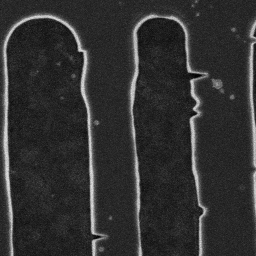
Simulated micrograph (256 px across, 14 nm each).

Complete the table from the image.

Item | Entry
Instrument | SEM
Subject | one or a few lines or trenches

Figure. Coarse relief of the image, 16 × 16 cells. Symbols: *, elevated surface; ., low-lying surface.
****************
*...*****..*****
.....***....****
.....****...****
.....****...****
.....***....****
.....***....****
......**....****
......**....****
......***...****
......***...****
*.....***...****
*.....***...****
*.....***....***
*.....***....***
*.....***....***